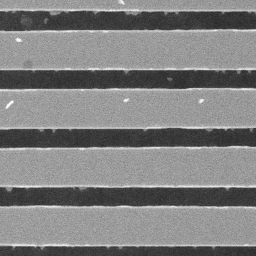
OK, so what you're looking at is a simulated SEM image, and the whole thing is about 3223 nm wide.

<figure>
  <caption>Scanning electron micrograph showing lines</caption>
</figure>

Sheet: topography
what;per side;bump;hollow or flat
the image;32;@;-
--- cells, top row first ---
@@@@@@@@@@@@@@@@@@@@@@@@@@@@@@@@
--------------------------------
--------------------------------
--------------------------------
@@@@@@@@@@@@@@@@@@@@@@@@@@@@@@@@
@@@@@@@@@@@@@@@@@@@@@@@@@@@@@@@@
@@@@@@@@@@@@@@@@@@@@@@@@@@@@@@@@
@@@@@@@@@@@@@@@@@@@@@@@@@@@@@@@@
@@@@@@@@@@@@@@@@@@@@@@@@@@@@@@@@
--------------------------------
--------------------------------
@@@@@@@@@@@@@@@@@@@@@@@@@@@@@@@@
@@@@@@@@@@@@@@@@@@@@@@@@@@@@@@@@
@@@@@@@@@@@@@@@@@@@@@@@@@@@@@@@@
@@@@@@@@@@@@@@@@@@@@@@@@@@@@@@@@
@@@@@@@@@@@@@@@@@@@@@@@@@@@@@@@@
--------------------------------
--------------------------------
-----------@@@@@@@@@@@@@@@@@@@@@
@@@@@@@@@@@@@@@@@@@@@@@@@@@@@@@@
@@@@@@@@@@@@@@@@@@@@@@@@@@@@@@@@
@@@@@@@@@@@@@@@@@@@@@@@@@@@@@@@@
@@@@@@@@@@@@@@@@@@@@@@@@@@@@@@@@
--------------------------------
--------------------------------
--------------------------------
@@@@@@@@@@@@@@@@@@@@@@@@@@@@@@@@
@@@@@@@@@@@@@@@@@@@@@@@@@@@@@@@@
@@@@@@@@@@@@@@@@@@@@@@@@@@@@@@@@
@@@@@@@@@@@@@@@@@@@@@@@@@@@@@@@@
@@@@@@@@@@@@@@@@@@@@@@@@@@@@@@@@
--------------------------------